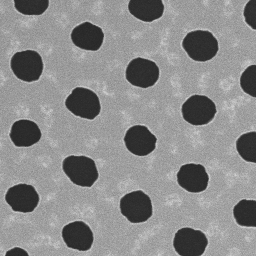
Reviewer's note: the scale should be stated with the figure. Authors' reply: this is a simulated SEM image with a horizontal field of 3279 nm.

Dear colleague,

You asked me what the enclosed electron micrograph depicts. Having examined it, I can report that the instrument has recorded a regular array of holes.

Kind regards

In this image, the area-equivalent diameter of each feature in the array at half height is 0.407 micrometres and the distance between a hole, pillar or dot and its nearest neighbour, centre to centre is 827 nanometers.